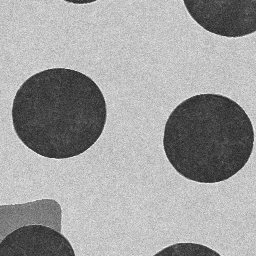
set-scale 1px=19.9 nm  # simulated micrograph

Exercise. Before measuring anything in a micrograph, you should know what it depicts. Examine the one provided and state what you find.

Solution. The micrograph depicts holes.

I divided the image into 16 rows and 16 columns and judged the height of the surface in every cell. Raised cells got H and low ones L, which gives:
HHHHHHHHHHHHLLLL
HHHHHHHHHHHHLLLL
HHHHHHHHHHHHHHHH
HHHHHHHHHHHHHHHH
HHHLLHHHHHHHHHHH
HLLLLLHHHHHHHHHH
HLLLLLLHHHHLLLLH
HLLLLLLHHHLLLLLL
HLLLLLHHHHLLLLLL
HHLLLHHHHHLLLLLL
HHHHHHHHHHHLLLLH
HHHHHHHHHHHHHHHH
HHLHHHHHHHHHHHHH
LLLLHHHHHHHHHHHH
LLLLHHHHHHHHHHHH
LLLLLHHHHHLLLHHH